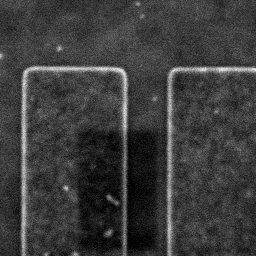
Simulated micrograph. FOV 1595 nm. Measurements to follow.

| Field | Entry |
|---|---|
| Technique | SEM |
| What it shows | wiring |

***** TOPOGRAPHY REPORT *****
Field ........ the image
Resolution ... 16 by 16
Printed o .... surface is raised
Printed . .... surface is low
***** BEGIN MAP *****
................
................
................
................
..oooooo...ooooo
.ooooooo...ooooo
.ooooooo...ooooo
.ooooooo...ooooo
.ooooooo...ooooo
.ooooooo...ooooo
.ooooooo...ooooo
.ooooooo...ooooo
.ooooooo...ooooo
.ooooooo...ooooo
.ooooooo...ooooo
.ooooooo...ooooo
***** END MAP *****